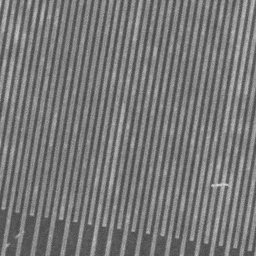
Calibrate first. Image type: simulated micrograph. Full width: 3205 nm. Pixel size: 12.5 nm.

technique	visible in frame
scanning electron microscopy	parallel lines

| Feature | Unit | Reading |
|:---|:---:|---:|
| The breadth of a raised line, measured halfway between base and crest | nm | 41.7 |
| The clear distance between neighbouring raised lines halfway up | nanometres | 51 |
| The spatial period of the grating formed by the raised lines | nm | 92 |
